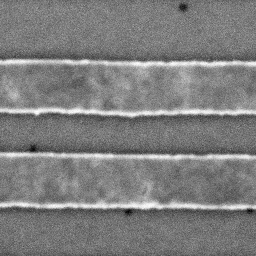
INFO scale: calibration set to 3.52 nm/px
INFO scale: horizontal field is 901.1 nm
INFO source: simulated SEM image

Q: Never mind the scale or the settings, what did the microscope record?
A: lines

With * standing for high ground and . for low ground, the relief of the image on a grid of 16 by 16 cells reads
................
................
................
................
****************
****************
****************
................
................
................
****************
****************
****************
................
................
................